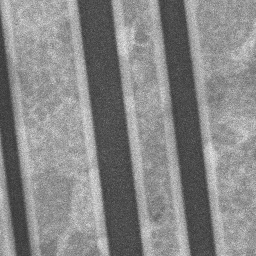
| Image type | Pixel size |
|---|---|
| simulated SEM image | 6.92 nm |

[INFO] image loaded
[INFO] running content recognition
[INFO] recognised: one or a few lines or trenches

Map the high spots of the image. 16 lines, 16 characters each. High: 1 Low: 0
1111100111001111
1111100111001111
0111100011001111
0111100011001111
0111100011001111
0111100011000111
0111100011000111
0111100011100111
0111110011100111
0111110011100111
0011110001100111
0011110001100111
0011110001100111
0011110001100111
1011110001100011
1011110001110011